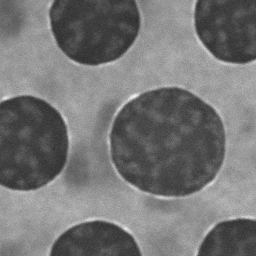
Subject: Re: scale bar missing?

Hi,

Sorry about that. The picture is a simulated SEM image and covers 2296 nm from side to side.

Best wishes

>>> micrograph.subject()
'holes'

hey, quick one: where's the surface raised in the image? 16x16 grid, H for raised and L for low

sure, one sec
HHHLLLLLLHHHLLLL
HHHLLLLLLHHHLLLL
HHHLLLLLHHHHLLLL
HHHHLLLLHHHHHLLL
HHHHHHHHHHHHHHHH
HHHHHHHHHHLHHHHH
LLLHHHHHLLLLLHHH
LLLLHHHLLLLLLLHH
LLLLHHHLLLLLLLHH
LLLLHHHLLLLLLLHH
LLLLHHHLLLLLLLHH
LLLHHHHHLLLLLHHH
HHHHHHHHHHHHHHHH
HHHHHHHHHHHHHHHH
HHHHLLLLHHHHHLLL
HHHLLLLLLHHHLLLL